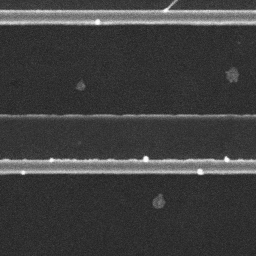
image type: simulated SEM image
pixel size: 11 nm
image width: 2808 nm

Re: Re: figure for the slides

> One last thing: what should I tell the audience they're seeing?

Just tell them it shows lines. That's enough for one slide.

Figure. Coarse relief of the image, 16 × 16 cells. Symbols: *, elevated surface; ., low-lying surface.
****************
......*.........
................
................
................
................
................
****************
****************
****************
****************
................
................
................
................
................